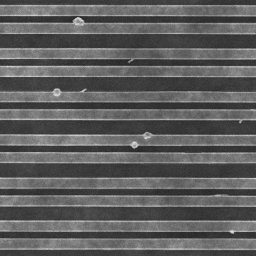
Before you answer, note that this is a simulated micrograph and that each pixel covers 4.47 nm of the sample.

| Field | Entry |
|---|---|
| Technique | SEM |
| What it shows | parallel lines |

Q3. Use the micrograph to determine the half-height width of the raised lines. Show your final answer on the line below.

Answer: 47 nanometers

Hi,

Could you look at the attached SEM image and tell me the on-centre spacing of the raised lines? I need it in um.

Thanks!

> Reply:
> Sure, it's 0.0948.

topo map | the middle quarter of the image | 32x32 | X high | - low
--------------------------------
XXXXXXXXXXXXXXXXXXXXXXXXXXXXXXXX
XXXXXXXXXXXXXXXXXXXXXXXXXXXXXXXX
--------------------------------
--------------------------------
--------------------------------
--------------------------------
XXXXXXXXXXXXXXXXXXXXXXXXXXXXXXXX
XXXXXXXXXXXXXXXXXXXXXXXXXXXXXXXX
--------------------------------
--------------------------------
--------------------------------
XXXXXXXXXXXXXXXXXXXXXXXXXXXXXXXX
XXXXXXXXXXXXXXXXXXXXXXXXXXXXXXXX
--------------------------------
--------------------------------
--------------------------------
--------------------XX----------
XXXXXXXXXXXXXXXXXXXXXXXXXXXXXXXX
XXXXXXXXXXXXXXXXXXXXXXXXXXXXXXXX
-----------------XX-------------
--------------------------------
XXXXXXXXXXXXXXXXXXXXXXXXXXXXXXXX
XXXXXXXXXXXXXXXXXXXXXXXXXXXXXXXX
XXXXXXXXXXXXXXXXXXXXXXXXXXXXXXXX
--------------------------------
--------------------------------
--------------------------------
--------------------------------
XXXXXXXXXXXXXXXXXXXXXXXXXXXXXXXX
XXXXXXXXXXXXXXXXXXXXXXXXXXXXXXXX
--------------------------------